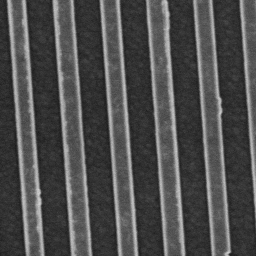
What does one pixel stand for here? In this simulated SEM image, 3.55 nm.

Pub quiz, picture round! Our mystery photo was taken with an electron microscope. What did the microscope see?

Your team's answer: parallel lines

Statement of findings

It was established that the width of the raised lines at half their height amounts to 65 nanometers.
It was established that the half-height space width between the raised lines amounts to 99.1 nanometres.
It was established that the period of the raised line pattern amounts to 46.5 px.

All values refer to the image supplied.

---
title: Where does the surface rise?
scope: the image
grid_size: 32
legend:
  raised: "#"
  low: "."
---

.##....##....##...###...##....##
.##....##....##...###...###...##
.##....##....##....##...###...##
.##....##....##....##...###...##
.##....##....##....##....##...##
.##....##....##....##....##...##
.###...##....##....##....##....#
..##...###...##....##....##....#
..##...###...##....##....##....#
..##...###...###...##....##....#
..##...###...###...##....##....#
..##....##...###...###...##....#
..##....##...###...###...###...#
..##....##....##...###...###...#
..##....##....##...###...###...#
..##....##....##....##...###...#
..##....##....##....##...###...#
..##....##....##....##...###...#
..##....##....##....##....##...#
..###...##....##....##....##....
..###...###...##....##....##....
...##...###...##....##....##....
...##...###...##....##....##....
...##...###...###...##....##....
...##...###...###...###...##....
...##....##...###...###...##....
...##....##....##...###...##....
...##....##....##...###...##....
...##....##....##...###...###...
...##....##....##...###...###...
...##....##....##....##...###...
...##....##....##....##...###...